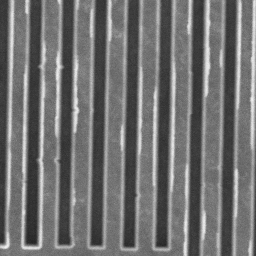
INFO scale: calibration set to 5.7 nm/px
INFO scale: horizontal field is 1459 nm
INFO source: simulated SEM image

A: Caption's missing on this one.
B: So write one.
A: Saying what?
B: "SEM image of parallel lines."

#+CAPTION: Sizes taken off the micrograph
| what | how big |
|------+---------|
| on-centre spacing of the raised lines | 185 nm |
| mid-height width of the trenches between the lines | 76.2 nanometers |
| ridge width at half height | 19.4 pixels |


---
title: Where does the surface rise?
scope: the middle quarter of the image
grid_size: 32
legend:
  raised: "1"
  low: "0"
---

00011110000111100001111100011111
00011110000111100001111100011111
00011110000111100001111000011111
00011110000111100001111100011111
00011110000111100001111100011111
00011110000111100001111000011111
00011110000111100001111000011111
00111110000111100001111000011111
00111110000111100001111000011111
00111110000111100001111000011111
00111110000111100001111000011111
00111110000111100001111000011111
00111110000111100001111000011111
00111110000111100001111000011110
00111110000111100001111000011110
00111110000111100001111000011110
00111110000111100001111000011110
00111110001111100001111000011110
00111110001111100001111000011110
00111110001111100001111000011110
00111110001111100001111000011110
00111110001111100001111000011110
00111110001111100001111000011110
00111110001111100001111000011110
00111110001111100001111000011110
00111110001111100001111000111110
00111110001111100011111000111110
00111110001111100011111000111110
00111110001111100011111000111110
00111110001111100011111000111110
00111110001111100011111000111110
00111110001111100011111000111110